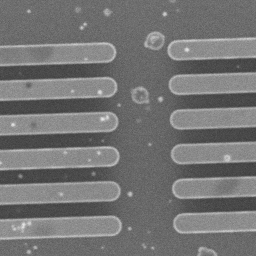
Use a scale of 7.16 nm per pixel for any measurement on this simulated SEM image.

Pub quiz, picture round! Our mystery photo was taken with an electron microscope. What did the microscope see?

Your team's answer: groups of lines, slits or small figures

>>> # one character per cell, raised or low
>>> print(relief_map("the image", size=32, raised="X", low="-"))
--------------------------------
--------------------------------
--------------------------------
--------------------------------
--------------------------------
------------XX-------XXXXXXXXXXX
XXXXXXXXXXXXXX-------XXXXXXXXXXX
XXXXXXXXXXXXXX------------------
--------------------------------
----------------------XXXXXXXXXX
XXXXXXXXXXXXXXX------XXXXXXXXXXX
XXXXXXXXXXXXXX--------XXXXXXXX--
XX------------------------------
-----------------------------XXX
-XXXXXXXXXXXXX-------XXXXXXXXXXX
XXXXXXXXXXXXXXX------XXXXXXXXXXX
XXXXXXXXXXXX--------------------
--------------------------------
-----------XXX--------XXXXXXXXXX
XXXXXXXXXXXXXXX------XXXXXXXXXXX
XXXXXXXXXXXXXX------------------
--------------------------------
----------------------XXXXXXXXXX
XXXXXXXXXXXXXXX-------XXXXXXXXXX
XXXXXXXXXXXXXXX-------XXXXXXXX--
X-------------------------------
-----------------------------XXX
-XXXXXXXXXXXXXX-------XXXXXXXXXX
XXXXXXXXXXXXXXX-------XXXXXXXXXX
XXXXXXXXXXXX--------------------
--------------------------------
--------------------------------